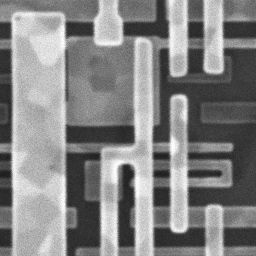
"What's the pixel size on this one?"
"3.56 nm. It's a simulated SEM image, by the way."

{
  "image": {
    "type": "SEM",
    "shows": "wiring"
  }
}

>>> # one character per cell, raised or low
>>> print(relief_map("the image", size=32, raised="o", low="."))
............ooo......oo...oo....
............ooo......oo...oo....
..oooooo....ooo......oo...oo....
..oooooo....ooo......oo...oo....
..oooooo....ooo......oo...oo....
..oooooo....ooo..oo..oo...oo....
..oooooo.........oo..oo...oo....
..oooooo.........oo..oo...oo....
..oooooo.........oo..oo..ooo....
..oooooo.........oo...o.........
..oooooo.........oo.............
..oooooo.........oo.............
..oooooo.........oo..oo.........
..oooooo.........oo..oo.........
..oooooo.........oo..oo.........
..oooooo.........oo..oo.........
..oooooo.........oo..oo.........
..oooooo.........oo..oo.........
..oooooo........ooo..oo.........
..oooooo.....oooooo..oo.........
..oooooo.....oo.ooo..oo.........
..oooooo.....oo..oo..oo.........
..oooooo.....oo..oo..oo.........
..oooooo.....oo..oo..oo.........
..oooooo.....oo..oo..oo.........
..oooooo.....oo..oo..oo.........
..oooooo.....oo..oo..oo...oo....
..oooooo.....oo..oo..oo...oo....
..oooooo.....oo..oo..oo...oo....
..oooooo.....oo..oo.......oo....
..oooooo.....oo..oo.......oo....
..oooooo.....oo..oo.......oo....